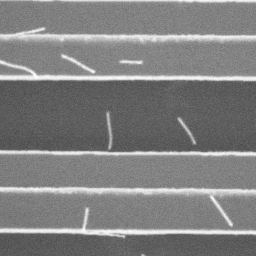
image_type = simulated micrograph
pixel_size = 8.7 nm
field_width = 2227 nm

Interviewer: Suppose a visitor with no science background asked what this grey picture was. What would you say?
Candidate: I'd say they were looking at lines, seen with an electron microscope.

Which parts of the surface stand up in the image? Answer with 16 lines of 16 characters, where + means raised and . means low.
++++++++++++++++
++++++++++++++++
++++++++++++++++
++++++++++++++++
++++++++++++++++
................
................
................
................
................
++++++++++++++++
++++++++++++++++
++++++++++++++++
++++++++++++++++
.....+.......+++
................